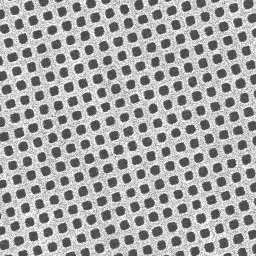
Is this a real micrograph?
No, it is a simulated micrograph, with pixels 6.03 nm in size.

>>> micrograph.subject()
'a regular array of holes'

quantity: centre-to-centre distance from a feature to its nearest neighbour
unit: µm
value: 0.0884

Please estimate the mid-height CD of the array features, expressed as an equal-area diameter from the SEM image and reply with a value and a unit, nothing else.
10 px